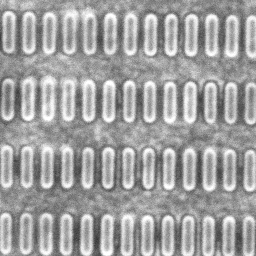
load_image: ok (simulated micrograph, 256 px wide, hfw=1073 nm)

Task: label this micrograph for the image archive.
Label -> groups of lines, slits or small figures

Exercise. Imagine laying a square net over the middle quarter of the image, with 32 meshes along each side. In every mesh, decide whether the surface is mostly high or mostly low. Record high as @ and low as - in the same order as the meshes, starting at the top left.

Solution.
--------------------------------
--------------------------------
--------------------------------
--------------------------------
@@---@@----@----@---------------
@@---@@---@@@--@@@--@@@--@@@---@
@@---@@---@@@--@@@--@@@--@@@--@@
@@---@@---@@@--@@@--@@@--@@@--@@
@@---@@---@@@--@@@--@@@--@@@--@@
@@---@@---@@@--@@@--@@@--@@@--@@
@@---@@---@@@--@@---@@@--@@@--@@
@@---@@---@@@--@@---@@@--@@@--@@
@@---@@---@@@--@@---@@@--@@@--@@
@@---@@---@@---@@---@@@--@@@--@@
--------------------------------
--------------------------------
--------------------------------
--------------------------------
--------------------------------
--------------------------------
--------------------------------
@@---@@---@@---@@---@@----@----@
@@---@@---@@---@@---@@---@@@--@@
@@---@@---@@---@@---@@---@@@--@@
@@---@@---@@---@@---@@---@@@--@@
@@---@@---@@---@@---@@---@@---@@
@@---@@---@@---@@---@@---@@---@@
@@---@@---@@---@@---@@---@@---@@
@@---@@---@@---@@---@@---@@---@@
@@---@@---@@---@@---@@---@@---@@
@----@@---@@---@@---@@---@@---@@
--------------------------------